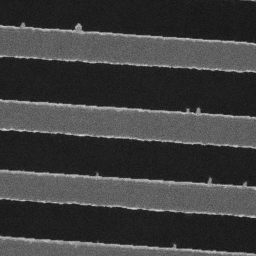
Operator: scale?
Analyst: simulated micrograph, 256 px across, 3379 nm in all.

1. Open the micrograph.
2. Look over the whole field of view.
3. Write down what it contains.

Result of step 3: lines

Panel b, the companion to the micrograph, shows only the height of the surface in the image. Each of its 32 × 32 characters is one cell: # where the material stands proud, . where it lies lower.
................................
................................
................................
####.....#......................
##################..............
################################
################################
........########################
.......................#########
................................
................................
................................
................................
#############...................
#############################...
################################
.....###########################
..................##############
...............................#
................................
................................
##..............................
##################..............
################################
################################
..........######################
......................##########
................................
................................
................................
############....................
############################....